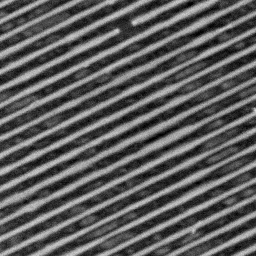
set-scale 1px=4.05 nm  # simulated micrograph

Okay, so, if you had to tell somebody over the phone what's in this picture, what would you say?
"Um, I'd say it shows parallel lines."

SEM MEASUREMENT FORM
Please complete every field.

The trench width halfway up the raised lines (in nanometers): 45.4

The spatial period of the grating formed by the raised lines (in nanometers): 60.7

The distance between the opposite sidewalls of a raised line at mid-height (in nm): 14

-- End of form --